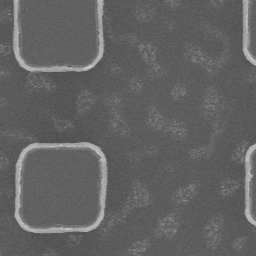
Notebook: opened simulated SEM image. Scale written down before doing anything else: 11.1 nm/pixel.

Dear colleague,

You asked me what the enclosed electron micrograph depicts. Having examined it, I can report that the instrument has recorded raised bodies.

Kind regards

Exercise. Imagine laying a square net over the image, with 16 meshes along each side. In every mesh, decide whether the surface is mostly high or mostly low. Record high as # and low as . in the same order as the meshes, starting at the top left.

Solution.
.#####.........#
.#####.........#
.#####.........#
.#####..........
................
................
................
................
................
..####..........
.######........#
.######........#
.#####.........#
.#####..........
................
................